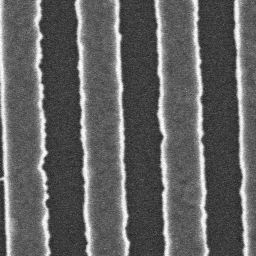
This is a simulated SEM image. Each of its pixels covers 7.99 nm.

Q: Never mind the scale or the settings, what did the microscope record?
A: one or a few lines or trenches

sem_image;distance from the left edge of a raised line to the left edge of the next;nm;632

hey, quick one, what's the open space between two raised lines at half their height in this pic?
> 319 nm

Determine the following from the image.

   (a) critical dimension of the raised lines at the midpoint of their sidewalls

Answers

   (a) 311 nanometres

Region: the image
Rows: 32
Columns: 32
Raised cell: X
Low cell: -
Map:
XXXXX-----XXXXX-----XXXX-----XXX
XXXXX-----XXXXX-----XXXX------XX
XXXXX-----XXXXX-----XXXXX-----XX
XXXXX-----XXXXX-----XXXX------XX
XXXXX-----XXXXX-----XXXX------XX
XXXXX-----XXXXX-----XXXXX-----XX
XXXXX-----XXXXX-----XXXXX-----XX
XXXXX-----XXXXX-----XXXXX-----XX
XXXXX-----XXXXX-----XXXXX-----XX
XXXXX-----XXXXX-----XXXXX-----XX
XXXXX-----XXXXX-----XXXXX-----XX
XXXXX-----XXXXX-----XXXXX-----XX
XXXXX-----XXXXX-----XXXXX-----XX
XXXXX-----XXXXX-----XXXXX-----XX
XXXXX-----XXXXX-----XXXXX-----XX
XXXXX-----XXXXX-----XXXXX-----XX
-XXXX-----XXXXX-----XXXXX-----XX
-XXXX-----XXXXX-----XXXXX-----XX
-XXXXX-----XXXX-----XXXXX-----XX
-XXXX------XXXX-----XXXXX-----XX
-XXXX------XXXX-----XXXXX-----XX
-XXXX------XXXX-----XXXXX-----XX
-XXXXX-----XXXX-----XXXXX-----XX
-XXXXX-----XXXX------XXXX-----XX
-XXXXX-----XXXX-----XXXXXX----XX
-XXXXX-----XXXXX----XXXXX-----XX
-XXXXX-----XXXXX-----XXXX-----XX
-XXXXX-----XXXXX-----XXXX-----XX
-XXXXX-----XXXXX-----XXXXX-----X
-XXXXX-----XXXXX-----XXXXX-----X
-XXXXX-----XXXXX-----XXXXX-----X
-XXXXX-----XXXXX-----XXXXX-----X